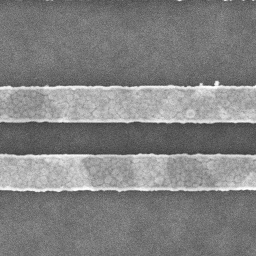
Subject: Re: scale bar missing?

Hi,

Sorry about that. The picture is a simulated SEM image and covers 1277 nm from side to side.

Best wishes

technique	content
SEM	lines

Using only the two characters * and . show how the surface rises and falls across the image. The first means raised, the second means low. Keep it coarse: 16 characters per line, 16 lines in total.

................
................
................
................
................
****************
****************
****************
................
................
****************
****************
................
................
................
................